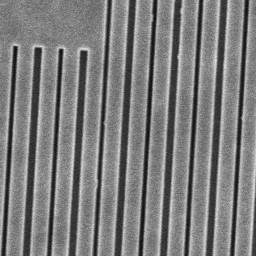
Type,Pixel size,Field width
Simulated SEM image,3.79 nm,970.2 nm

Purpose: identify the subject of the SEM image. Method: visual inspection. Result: parallel lines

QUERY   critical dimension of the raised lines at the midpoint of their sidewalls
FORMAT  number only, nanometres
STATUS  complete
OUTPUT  61.9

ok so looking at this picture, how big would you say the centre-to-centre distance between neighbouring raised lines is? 0.0871 um